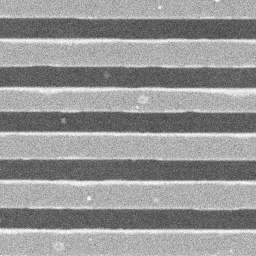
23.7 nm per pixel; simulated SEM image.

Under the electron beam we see lines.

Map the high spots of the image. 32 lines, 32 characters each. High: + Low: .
++++++++++++++++++++++++++++++++
++++++++++++++++++++++++++++++++
................................
................................
................................
++++++++++++++++++++++++++++++++
++++++++++++++++++++++++++++++++
++++++++++++++++++++++++++++++++
................................
................................
................................
++++++++++++++++++++++++++++++++
++++++++++++++++++++++++++++++++
++++++++++++++++++++++++++++++++
................................
................................
................................
++++++++++++++++++++++++++++++++
++++++++++++++++++++++++++++++++
++++++++++++++++++++++++++++++++
................................
................................
................................
++++++++++++++++++++++++++++++++
++++++++++++++++++++++++++++++++
++++++++++++++++++++++++++++++++
................................
................................
................................
++++++++++++++++++++++++++++++++
++++++++++++++++++++++++++++++++
++++++++++++++++++++++++++++++++